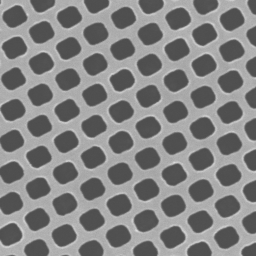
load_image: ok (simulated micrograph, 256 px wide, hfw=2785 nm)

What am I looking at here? a regular array of holes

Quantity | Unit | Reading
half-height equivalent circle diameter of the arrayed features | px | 23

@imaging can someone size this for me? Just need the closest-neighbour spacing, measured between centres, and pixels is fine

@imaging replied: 31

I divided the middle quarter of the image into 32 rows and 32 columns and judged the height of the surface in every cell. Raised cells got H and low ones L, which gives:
HHHHHLLLLLLHHHHHHHLLLLLLHHHHHHHH
LLLHHLLLLLHHHHLLHHHLLLLLHHHHLLHH
LLLLHHLLLHHHHLLLLHHLLLHHHHLLLLHH
LLLLHHHHHHHLLLLLLLHHHHHHHLLLLLLH
LLLLHHHHHHHLLLLLLLHHHHHHHLLLLLLH
LLLHHHHLLLHHLLLLLHHHHLLHHLLLLLLH
LHHHHLLLLLHHHLLHHHHLLLLLHHLLLHHH
HHHHLLLLLLLHHHHHHHLLLLLLHHHHHHHH
HHHHHLLLLLLHHHHHHHLLLLLLHHHHHHHH
LLLHHLLLLLHHHLLLHHHLLLLHHHHLLLHH
LLLHHHLLHHHHLLLLLHHLLLHHHHLLLLHH
LLLLHHHHHHHLLLLLLHHHHHHHHLLLLLLH
LLLLHHHHHHHLLLLLLHHHHHHHHLLLLLLH
LLLHHHLLLLHHLLLLLHHHLLLHHLLLLLHH
LHHHHLLLLLHHHLLHHHLLLLLLHHLLLHHH
HHHHLLLLLLLHHHHHHHLLLLLLHHHHHHHL
HHHHHLLLLLLHHHHHHHLLLLLLHHHHHHHL
LLLHHLLLLHHHHLLLHHHLLLLHHHHLLLHH
LLLHHHHHHHHLLLLLLHHHLHHHHLLLLLHH
LLLLHHHHHHHLLLLLLHHHHHHHHLLLLLLH
LLLHHHHHHHHLLLLLLHHHHHHHHLLLLLLH
LLHHHLLLLHHHLLLLHHHLLLLHHLLLLLHH
HHHHLLLLLLHHHLHHHHLLLLLLHHLLHHHH
HHHHLLLLLLLHHHHHHHLLLLLLHHHHHHHL
LLHHHLLLLLHHHHHHHHLLLLLLHHHHHHHL
LLLHHLLLLHHHLLLLHHHLLLLHHHLLLLHH
LLLHHHHHHHHLLLLLLHHHHHHHHLLLLLHH
LLLLHHHHHHHLLLLLLHHHHHHHLLLLLLLH
LLLHHHHLHHHLLLLLLHHHHHHHHLLLLLLH
LHHHHLLLLLHHLLLLHHHLLLLHHLLLLLHH
HHHHLLLLLLHHHHHHHHLLLLLLHHHLHHHH
HHHHLLLLLLHHHHHHHHLLLLLLHHHHHHHL